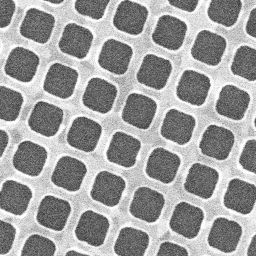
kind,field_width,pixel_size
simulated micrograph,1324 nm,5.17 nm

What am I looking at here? a regular array of holes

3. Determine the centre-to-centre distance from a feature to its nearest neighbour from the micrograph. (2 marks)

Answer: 215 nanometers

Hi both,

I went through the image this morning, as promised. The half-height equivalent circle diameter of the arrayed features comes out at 185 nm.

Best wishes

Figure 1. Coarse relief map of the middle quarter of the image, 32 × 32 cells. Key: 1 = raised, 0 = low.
00111111100000001110000000011111
00011111110000001100000000011100
00001111111100011100000000011000
00001110011111111100000000111000
00011100000011111110000000111000
00011000000001111111000001110000
00011000000001111111111011110000
00111000000001110001111111110000
01110000000001110000001111110000
11110000000011100000000111111100
11111000000011100000000011111111
11111110000011100000000111000111
11111111100111000000000110000001
11000011111111000000001110000000
11000000011111100000001110000000
10000000011111111000001100000000
10000000001111111111111100000000
10000000011100000111111100000000
00000000011100000011111110000000
10000000011000000001111111100001
10000000111000000001111111111111
11110000110000000001110000111111
11111111110000000001100000001111
00111111110000000001100000000111
00000111111000000011100000000111
00000011111110000111000000000111
00000011110111111111000000000110
00000011000001111111000000001110
00000111000000011111110000001100
00000110000000011111111000011100
00000110000000001111111111111100
00001110000000011100000111111100